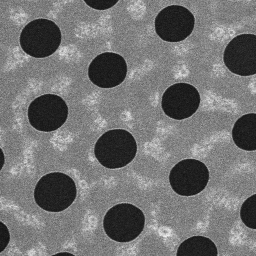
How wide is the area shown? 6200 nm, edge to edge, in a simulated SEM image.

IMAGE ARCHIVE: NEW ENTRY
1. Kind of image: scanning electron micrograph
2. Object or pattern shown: a regular array of holes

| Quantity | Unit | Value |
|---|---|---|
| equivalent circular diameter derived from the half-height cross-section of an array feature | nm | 958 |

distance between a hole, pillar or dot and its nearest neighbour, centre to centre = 1800 nanometres